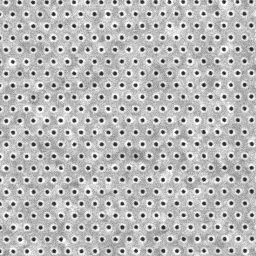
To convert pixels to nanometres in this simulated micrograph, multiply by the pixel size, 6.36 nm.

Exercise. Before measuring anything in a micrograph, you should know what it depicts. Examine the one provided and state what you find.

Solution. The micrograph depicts a regular array of holes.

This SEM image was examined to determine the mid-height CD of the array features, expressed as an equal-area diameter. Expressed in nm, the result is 30.4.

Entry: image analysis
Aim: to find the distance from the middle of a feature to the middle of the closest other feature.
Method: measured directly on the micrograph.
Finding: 0.0832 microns